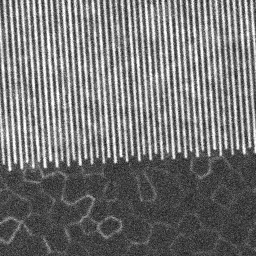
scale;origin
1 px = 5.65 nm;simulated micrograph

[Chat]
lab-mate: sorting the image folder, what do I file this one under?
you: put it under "parallel lines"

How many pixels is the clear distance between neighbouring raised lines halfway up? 3.73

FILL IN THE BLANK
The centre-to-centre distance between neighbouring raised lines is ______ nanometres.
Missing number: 33.2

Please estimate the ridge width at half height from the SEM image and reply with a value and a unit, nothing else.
12.7 nanometers